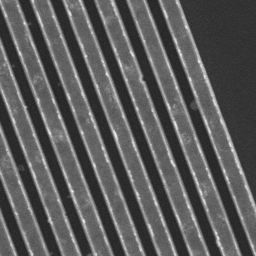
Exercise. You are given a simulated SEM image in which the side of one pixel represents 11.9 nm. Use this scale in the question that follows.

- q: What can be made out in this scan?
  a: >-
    parallel lines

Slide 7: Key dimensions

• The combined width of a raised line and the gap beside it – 359 nanometers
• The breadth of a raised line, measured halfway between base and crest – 220 nanometres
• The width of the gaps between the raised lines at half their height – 143 nm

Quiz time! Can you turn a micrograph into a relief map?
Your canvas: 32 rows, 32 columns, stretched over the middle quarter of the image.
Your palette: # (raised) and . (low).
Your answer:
##....#####...#####...#####...##
###...#####...#####...#####...##
###....####....####....####....#
####...#####...####....#####...#
####...#####...#####...#####...#
####....####....#####...####....
#####...#####...#####...#####...
#####...#####...#####....####...
.####....#####...#####...#####..
.#####...#####...#####...#####..
..####....####....####....####..
..#####...#####...#####...#####.
..#####...#####...#####...#####.
...####....####....####....####.
...#####...#####...#####...#####
...#####....####...#####....####
#...####....#####...#####...####
#...#####...#####...#####...####
#....####....####....####....###
##...#####...#####...#####...###
##...#####...#####...#####...###
##....####....####....#####...##
###...#####...#####...#####...##
###...#####....####...#####....#
####...####....#####...#####...#
####...#####...#####...#####...#
####....####....####....####....
#####...#####...#####...#####...
#####...#####...#####...#####...
.####....####....####....#####..
.#####...#####...#####...#####..
.#####...#####....####...#####..